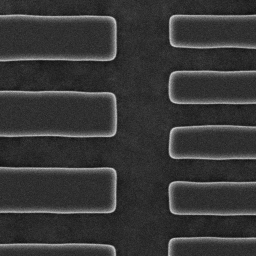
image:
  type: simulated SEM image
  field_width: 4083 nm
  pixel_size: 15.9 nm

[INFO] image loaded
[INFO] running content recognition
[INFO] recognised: groups of lines, slits or small figures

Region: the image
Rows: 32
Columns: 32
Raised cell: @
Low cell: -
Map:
--------------------------------
--------------------------------
@@@@@@@@@@@@@@-------@@@@@@@@@@@
@@@@@@@@@@@@@@-------@@@@@@@@@@@
@@@@@@@@@@@@@@-------@@@@@@@@@@@
@@@@@@@@@@@@@@--------@@@@@@@@@@
@@@@@@@@@@@@@@------------------
@@----------@@------------------
--------------------------------
---------------------@@@@@@@@@@@
---------------------@@@@@@@@@@@
---------------------@@@@@@@@@@@
@@@@@@@@@@@@@@-------@@@@@@@@@@@
@@@@@@@@@@@@@@@-----------------
@@@@@@@@@@@@@@@-----------------
@@@@@@@@@@@@@@@-----------------
@@@@@@@@@@@@@@-------@@@@@@@@@@@
---------------------@@@@@@@@@@@
---------------------@@@@@@@@@@@
---------------------@@@@@@@@@@@
--------------------------------
@@@@@@@@@@@@@@------------------
@@@@@@@@@@@@@@------------------
@@@@@@@@@@@@@@-------@@@@@@@@@@@
@@@@@@@@@@@@@@-------@@@@@@@@@@@
@@@@@@@@@@@@@@-------@@@@@@@@@@@
------@@@@@@@@--------@@@@@@@@@@
--------------------------------
--------------------------------
--------------------------------
---------------------@@@@@@@@@@@
@@@@@@@@@@@@@@-------@@@@@@@@@@@